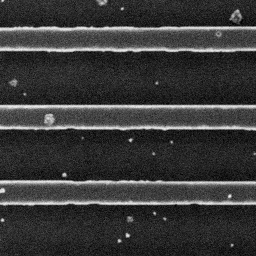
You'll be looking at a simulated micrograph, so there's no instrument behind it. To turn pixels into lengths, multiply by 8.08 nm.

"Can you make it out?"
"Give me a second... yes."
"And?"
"lines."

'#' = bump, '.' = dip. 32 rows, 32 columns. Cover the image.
................................
................................
................................
.....##...#...###...############
################################
################################
................................
................................
................................
................................
................................
................................
................................
################################
################################
################################
................................
................................
................................
................................
................................
................................
................................
################################
################################
###########.####################
................................
................................
................................
................................
................................
................................